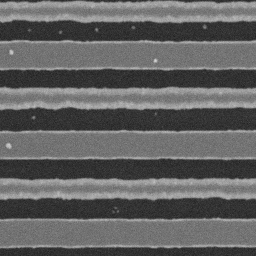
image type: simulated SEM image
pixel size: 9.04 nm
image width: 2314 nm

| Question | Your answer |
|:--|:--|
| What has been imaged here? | lines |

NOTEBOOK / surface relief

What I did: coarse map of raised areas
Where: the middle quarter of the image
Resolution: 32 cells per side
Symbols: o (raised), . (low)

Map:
oooooooooooooooooooooooooooooooo
................................
................................
................................
................................
................................
ooooo.oo........ooo.oo..oooooooo
oooooooooooooooooooooooooooooooo
oooooooooooooooooooooooooooooooo
oooooooooooooooooooooooooooooooo
o.oooooooooooooooooooooooooooooo
................................
................................
................................
................................
................................
................................
oooooooooooooooooooooooooooooooo
oooooooooooooooooooooooooooooooo
oooooooooooooooooooooooooooooooo
oooooooooooooooooooooooooooooooo
oooooooooooooooooooooooooooooooo
oooooooooooooooooooooooooooooooo
oooooooooooooo.ooooooooo...ooooo
................................
................................
................................
................................
................................
oooooooooooooooooooooooooooooooo
oooooooooooooooooooooooooooooooo
oooooooooooooooooooooooooooooooo